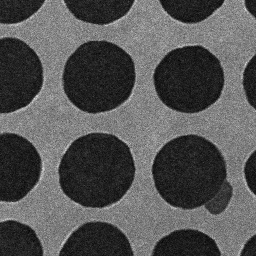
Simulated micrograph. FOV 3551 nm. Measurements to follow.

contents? holes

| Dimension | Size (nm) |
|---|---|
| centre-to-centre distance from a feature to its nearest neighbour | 1280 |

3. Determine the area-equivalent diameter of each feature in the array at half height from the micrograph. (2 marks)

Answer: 1.04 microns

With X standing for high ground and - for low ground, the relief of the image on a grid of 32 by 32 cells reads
-----XXX---------XXX--------XXX-
-----XXXX-------XXXXX------XXXX-
---XXXXXXX-----XXXXXXX---XXXXXXX
XXXXXXXXXXXXXXXXXXXXXXXXXXXXXXXX
XXXXXXXXXXXXXXXXXXXXXXXXXXXXXXXX
---XXXXXXX----XXXXXXXXXXXXXXXXXX
----XXXXX-------XXXXX-----XXXXXX
-----XXX---------XXX-------XXXX-
-----XXX---------XX---------XXX-
-----XXX---------XX---------XX--
-----XXX---------XX---------XX--
-----XXX--------XXXX--------XXX-
----XXXXX-------XXXX-------XXXX-
---XXXXXXX----XXXXXXX-----XXXXXX
XXXXXXXXXXXXXXXXXXXXXXXXXXXXXXXX
XXXXXXXXXXXXXXXXXXXXXXXXXXXXXXXX
XXXXXXXXXXXXXXXXXXXXXXXXXXXXXXXX
----XXXXX------XXXXXX-----XXXXXX
----XXXX--------XXXX-------XXXXX
-----XXX---------XX---------XXX-
-----XX----------XX---------XXX-
-----XX----------XX---------XX--
-----XX----------XX---------XXX-
----XXXX--------XXX----------XX-
---XXXXX-------XXXXX---------XXX
XXXXXXXXXX----XXXXXXX--------XXX
XXXXXXXXXXXXXXXXXXXXXXXXXX--XXXX
X-XXXXXXXXXXXXXXXXXXXXXXXXXXXXXX
----XXXXXX-----XXXXXXXXXXXXXXXXX
-----XXXX-------XXXXX-----XXXXXX
-----XXX--------XXXX-------XXXX-
-----XX----------XX---------XX--